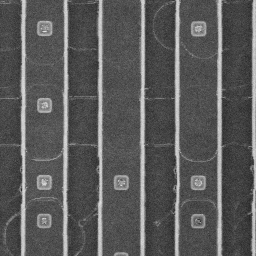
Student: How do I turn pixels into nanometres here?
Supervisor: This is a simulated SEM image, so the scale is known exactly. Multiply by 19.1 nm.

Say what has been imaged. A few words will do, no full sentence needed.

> wiring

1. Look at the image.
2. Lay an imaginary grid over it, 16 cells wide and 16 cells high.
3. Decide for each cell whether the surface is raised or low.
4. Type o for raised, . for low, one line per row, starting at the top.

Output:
.ooo..ooo..ooo..
.ooo..ooo..ooo..
.ooo..ooo..ooo..
.ooo..ooo..ooo..
.ooo..ooo..ooo..
.ooo..ooo..ooo..
.ooo..ooo..ooo..
.ooo..ooo..ooo..
.ooo..ooo..ooo..
.ooo..ooo..ooo..
..oo..ooo..ooo..
..oo..ooo..ooo..
.ooo..ooo..ooo..
.ooo..ooo..ooo..
.ooo..ooo..ooo..
.ooo..ooo..ooo..